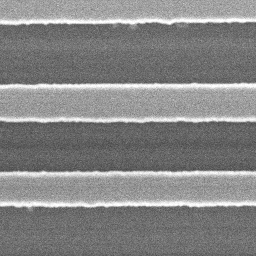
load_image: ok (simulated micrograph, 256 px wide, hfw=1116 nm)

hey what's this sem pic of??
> lines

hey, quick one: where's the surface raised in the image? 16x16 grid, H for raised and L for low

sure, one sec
HHHHHHHHHHHHHHHH
HHHLLHLLLLLLLLLL
LLLLLLLLLLLLLLLL
LLLLLLLLLLLLLLLL
LLLLLLLLLLLLLLLL
HHHHHHHHHHHHHHHH
HHHHHHHHHHHHHHHH
HHHHHHHHHHHHHHHH
LLLLLLLLLLLLLLLL
LLLLLLLLLLLLLLLL
LLLLLLLLLLLLLLLL
HHHHHHHHHHHHHHHH
HHHHHHHHHHHHHHHH
LLLLLLLLLLLLLLLL
LLLLLLLLLLLLLLLL
LLLLLLLLLLLLLLLL